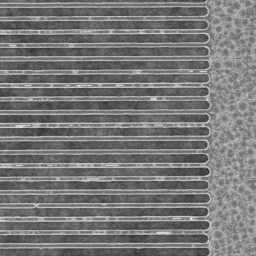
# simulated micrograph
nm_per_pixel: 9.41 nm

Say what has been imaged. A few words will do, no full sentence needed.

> parallel lines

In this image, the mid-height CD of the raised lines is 42.4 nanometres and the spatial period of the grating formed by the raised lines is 126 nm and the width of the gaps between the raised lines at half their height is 85.9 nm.